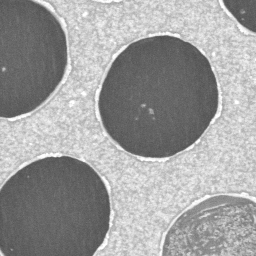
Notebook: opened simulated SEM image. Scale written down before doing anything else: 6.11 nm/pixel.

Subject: holes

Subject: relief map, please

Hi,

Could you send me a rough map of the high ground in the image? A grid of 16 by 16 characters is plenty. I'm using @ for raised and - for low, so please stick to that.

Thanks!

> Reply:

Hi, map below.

---@@@@@@@@@@@--
----@@@@@@@@@@@-
----@@@@@--@@@@@
----@@@------@@@
----@@@------@@@
----@@--------@@
---@@@--------@@
@@@@@@-------@@@
@@@@@@@------@@@
@@@@@@@@---@@@@@
@-----@@@@@@@@@@
-------@@@@@@@@@
-------@@@@@@---
-------@@@@-----
-------@@@------
------@@@@------